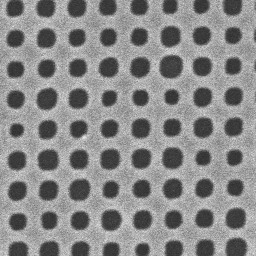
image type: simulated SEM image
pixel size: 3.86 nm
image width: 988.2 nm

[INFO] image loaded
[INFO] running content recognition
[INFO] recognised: a regular array of holes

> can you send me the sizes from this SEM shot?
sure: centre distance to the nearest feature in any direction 0.117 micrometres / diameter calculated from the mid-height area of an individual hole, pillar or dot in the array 75.9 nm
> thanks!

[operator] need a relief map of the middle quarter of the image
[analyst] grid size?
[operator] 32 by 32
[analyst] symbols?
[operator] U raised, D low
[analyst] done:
UDDDDDUUUDDDDDUUDDDDDDUUDDDDDDUU
UDDDDDUUUDDDDDUUDDDDDUUUDDDDDDUU
UDDDDUUUUDDDDUUUUDDDDUUUDDDDDUUU
UUUDUUUUUUUDUUUUUUDDUUUUUDDDUUUU
UUUUUUUUUUUUUUUUUUUUUUUUUUUUUUUU
UUUUUUUUUUUUUUUUUUUUUUUUUUUUUUUU
UUDDDUUUUUUUUUUUUUDDDUUUUUDDUUUU
UDDDDDUUUUDDDUUUUDDDDUUUUDDDDUUU
UDDDDDUUUDDDDUUUUDDDDUUUUDDDDUUU
UDDDDDUUUDDDDUUUUDDDDUUUUDDDDUUU
UDDDDUUUUUDDUUUUUUDDUUUUUUUUUUUU
UUUUUUUUUUUUUUUUUUUUUUUUUUUUUUUU
UUUUUUUUUUUUUUUUUUUUUUUUUUUUUUUU
UUUUUUUUUUUUUUUUUUUDUUUUUUDDUUUU
UUDDDUUUUUDDDUUUUDDDDUUUUDDDDUUU
UUDDDDUUUDDDDDUUUDDDDDUUUDDDDUUU
UDDDDDUUUDDDDDUUUDDDDDUUUDDDDUUU
UUDDDDUUUDDDDUUUUDDDDUUUUDDDDUUU
UUUDUUUUUUDDUUUUUUDDDUUUUUUUUUUU
UUUUUUUUUUUUUUUUUUUUUUUUUUUUUUUU
UUUUUUUUUUUUUUUUUUUUUUUUUUUUUUUU
UUUDDUUUUUDDDUUUUUDDDUUUUDDDDUUU
UUDDDDUUUDDDDDUUUDDDDDUUUDDDDDUU
UDDDDDUUUDDDDDUUUDDDDDUUDDDDDDUU
UDDDDDUUUDDDDDUUUDDDDDUUDDDDDDUU
UUDDDDUUUDDDDDUUUDDDDUUUUDDDDUUU
UUUDDUUUUUUDUUUUUUUUUUUUUUUUUUUU
UUUUUUUUUUUUUUUUUUUUUUUUUUUUUUUU
UUUUUUUUUUUUUUUUUUUUUUUUUUUDUUUU
UUDDDDUUUUUDDUUUUUDDDUUUUDDDDUUU
UDDDDDDUUUDDDDUUUDDDDDUUUDDDDDUU
UDDDDDDUUDDDDDUUUDDDDDUUUDDDDDUU